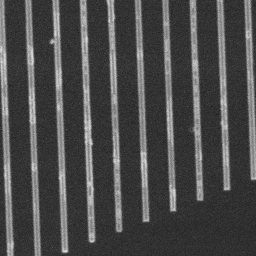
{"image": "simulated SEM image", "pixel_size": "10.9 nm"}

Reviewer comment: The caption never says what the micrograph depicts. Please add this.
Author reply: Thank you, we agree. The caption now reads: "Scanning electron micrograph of parallel lines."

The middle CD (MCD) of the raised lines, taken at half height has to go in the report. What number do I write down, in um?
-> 0.0516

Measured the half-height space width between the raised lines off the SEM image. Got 22.9 px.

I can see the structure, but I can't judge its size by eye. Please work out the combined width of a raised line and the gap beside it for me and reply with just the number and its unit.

298 nanometers